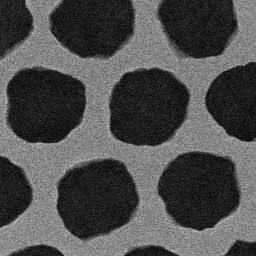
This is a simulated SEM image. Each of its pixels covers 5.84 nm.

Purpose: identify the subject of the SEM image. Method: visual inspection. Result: holes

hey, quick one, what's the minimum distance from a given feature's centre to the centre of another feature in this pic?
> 100 pixels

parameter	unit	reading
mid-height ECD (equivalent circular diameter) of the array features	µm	0.468